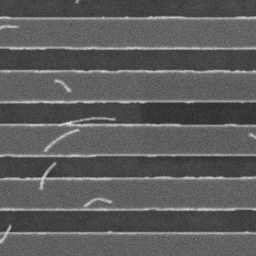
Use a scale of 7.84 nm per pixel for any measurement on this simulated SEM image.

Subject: lines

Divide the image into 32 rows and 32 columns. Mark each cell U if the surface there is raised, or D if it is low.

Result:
DDDDDDDDDDDDDDDDDDDDDDDDDDDDDDDD
DDDDDDDDDDDDDDDDDDDDDDDDDDDDDDDD
UUUUUUUUUUUUUUUUUUUUUUUUUUUUUUUU
UUUUUUUUUUUUUUUUUUUUUUUUUUUUUUUU
UUUUUUUUUUUUUUUUUUUUUUUUUUUUUUUU
UUUUUUUUUUUUUUUUUUUUUUUUUUUUUUUU
DDDDDDDDDDDDDDDDDDDDDDDDDDDDDDDD
DDDDDDDDDDDDDDDDDDDDDDDDDDDDDDDD
DDDDDDDDDDDDDDDDDDDDDDDDDDDDDDDD
UUUUUUUUUUUUUUUUUUUUUUUUUUUUUUUU
UUUUUUUUUUUUUUUUUUUUUUUUUUUUUUUU
UUUUUUUUUUUUUUUUUUUUUUUUUUUUUUUU
UUUUUUUUUUUUUUUUUUUUUUUUUUUUUUUU
DDDDDDDDDDDDDDDDDDDDDDDDDDDDDDDD
DDDDDDDDDDDDDDDDDDDDDDDDDDDDDDDD
DDDDDDDUUDDDDDDDDDDDDDDDDDDDDDDD
UUUUUUUUUUUUUUUUUUUUUUUUUUUUUUUU
UUUUUUUUUUUUUUUUUUUUUUUUUUUUUUUU
UUUUUUUUUUUUUUUUUUUUUUUUUUUUUUUU
UUUUUUUUUUUUDDDDDDUDDDDDDDDDDDDD
DDDDDDDDDDDDDDDDDDDDDDDDDDDDDDDD
DDDDDDDDDDDDDDDDDDDDDDDDDDDDDDDD
UUUUUUUUUUUUUUUUUUUUUUUUUUUUUUUU
UUUUUUUUUUUUUUUUUUUUUUUUUUUUUUUU
UUUUUUUUUUUUUUUUUUUUUUUUUUUUUUUU
UUUUUUUUUUUUUUUUUUUUUUUUUUUUUUUU
DDDDDDDDDDDDDDDDDDDDDDDDDDDDDDDD
DDDDDDDDDDDDDDDDDDDDDDDDDDDDDDDD
DDDDDDDDDDDDDDDDDDDDDDDDDDDDDDDD
UUUUUUUUUUUUUUUUUUUUUUUUUUUUUUUU
UUUUUUUUUUUUUUUUUUUUUUUUUUUUUUUU
UUUUUUUUUUUUUUUUUUUUUUUUUUUUUUUU